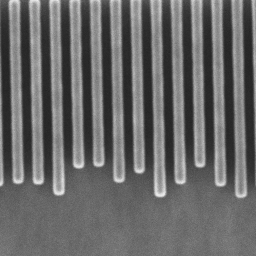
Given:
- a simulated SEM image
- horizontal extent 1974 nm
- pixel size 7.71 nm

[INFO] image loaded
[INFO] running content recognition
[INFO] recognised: groups of lines, slits or small figures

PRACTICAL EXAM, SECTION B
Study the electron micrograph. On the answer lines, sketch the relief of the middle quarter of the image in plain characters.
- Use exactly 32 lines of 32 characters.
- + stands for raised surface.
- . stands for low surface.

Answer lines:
..++...++...++...+++..+++..+++..
..++...++...++...+++..+++..+++..
..++...++...++...+++..+++..+++..
..++...++...++...+++..+++..+++..
..++...++...++...+++..+++..+++..
..++...++...++...+++..+++..+++..
..+++..++...++...+++..+++..+++..
..+++..++...++...+++..+++..+++..
..+++..+++..++...+++..+++..+++..
..+++..+++..+++..+++..+++...++..
..+++..+++..+++..+++..+++...++..
..+++..+++..+++..+++..+++...++..
..+++..+++..+++..+++..+++...++..
..+++..+++..+++..+++..+++...++..
..+++..+++..+++..+++..+++...++..
..+++..+++..+++..+++..+++...++..
..+++..+++..+++..+++..+++...++..
..+++..+++..+++..+++..+++...++..
..+++..+++..+++..+++..+++...++..
..+++..+++..+++..+++..+++...++..
..+++..+++...++...++..+++...++..
..+++...++...++...++...++...++..
..+++...++...++...++...++...++..
..+++...++...++...++...++...++..
..+++...++...++...++...++...++..
...++........++...++...++...++..
.............++...++...++...++..
.............++........++...++..
.............++........++...++..
.......................++...++..
.......................++.......
.......................++.......